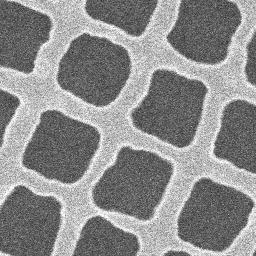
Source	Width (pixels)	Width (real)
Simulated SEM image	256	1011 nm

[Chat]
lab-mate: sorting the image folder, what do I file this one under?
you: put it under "holes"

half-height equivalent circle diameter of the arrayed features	282	nanometers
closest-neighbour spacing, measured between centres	334	nanometers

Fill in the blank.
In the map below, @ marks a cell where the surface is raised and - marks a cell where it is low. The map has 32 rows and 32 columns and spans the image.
---@@@@@@@@---------@@@------@@@
-----@@@@@@--------@@@--------@@
------@@@@@@-------@@@--------@@
------@@@@@@@@@---@@@@--------@@
------@@@@--@@@@-@@@@--------@@@
-----@@@@-----@@@@@@@--------@@-
-----@@@--------@@@@@@------@@@-
----@@@@--------@@@@@@@@----@@@-
@---@@@---------@@@@@@@@@@@@@@@-
@@@@@@@---------@@@----@@@@@@@@-
@@@@@@@---------@@@-------@@@@@-
-@@@@@@@@------@@@--------@@@@@@
--@@@@@@@@----@@@@--------@@@-@@
--@@@@@@@@@@@@@@@--------@@@----
--@@@---@@@@@@@@---------@@@----
-@@@@------@@@@@@--------@@@----
-@@@--------@@@@@@-------@@-----
@@@@--------@@@@@@@@----@@@-----
@@@---------@@@--@@@@@@@@@@-----
@@@---------@@@-----@@@@@@@-----
@@@--------@@@-------@@@@@@@@---
@@@@-------@@---------@@@@@@@@@-
@@@@@@@---@@---------@@@@-@@@@@@
@@--@@@@@@@@---------@@@-----@@@
@----@@@@@@@--------@@@@-------@
--------@@@@--------@@@---------
--------@@@@@@-----@@@@--------@
--------@@@--@@@@@-@@@---------@
--------@@-----@@@@@@@--------@@
-------@@@-------@@@@@--------@@
-------@@--------@@@@@@@-----@@@
-------@@--------@@@@--@@@@@@@@@